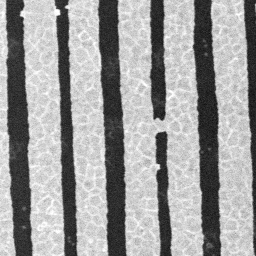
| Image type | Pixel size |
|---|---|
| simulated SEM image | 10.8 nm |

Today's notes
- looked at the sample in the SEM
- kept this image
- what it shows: parallel lines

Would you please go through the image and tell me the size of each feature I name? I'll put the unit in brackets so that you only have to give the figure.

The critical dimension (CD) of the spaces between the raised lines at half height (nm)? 196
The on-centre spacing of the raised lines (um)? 0.512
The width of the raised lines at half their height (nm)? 335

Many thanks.